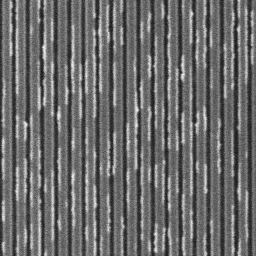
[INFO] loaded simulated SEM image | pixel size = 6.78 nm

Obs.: parallel lines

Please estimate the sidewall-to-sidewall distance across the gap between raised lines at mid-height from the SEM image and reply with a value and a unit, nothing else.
4.75 pixels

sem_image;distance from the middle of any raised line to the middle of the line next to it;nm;94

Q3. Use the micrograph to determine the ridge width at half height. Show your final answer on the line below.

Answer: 57.6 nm